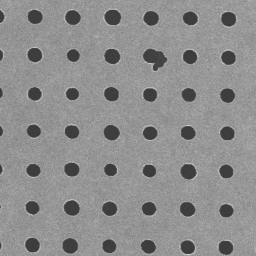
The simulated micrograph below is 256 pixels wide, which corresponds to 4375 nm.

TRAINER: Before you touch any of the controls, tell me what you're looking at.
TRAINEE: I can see a regular array of holes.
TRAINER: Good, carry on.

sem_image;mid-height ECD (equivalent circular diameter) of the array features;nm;247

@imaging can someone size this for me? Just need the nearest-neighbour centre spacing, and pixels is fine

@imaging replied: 37.7